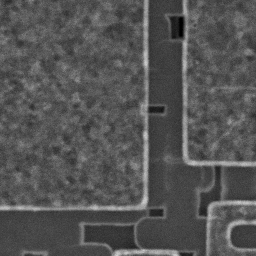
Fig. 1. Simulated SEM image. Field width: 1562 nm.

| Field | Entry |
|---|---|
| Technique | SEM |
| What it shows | wiring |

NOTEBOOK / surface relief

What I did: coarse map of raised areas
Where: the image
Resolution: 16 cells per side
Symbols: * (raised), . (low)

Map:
*********...****
*********...****
*********...****
*********...****
*********...****
*********...****
*********...****
*********...****
*********...****
*********...****
*********.......
*********.......
*********.......
.............***
.............*..
.............**.